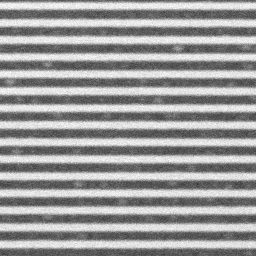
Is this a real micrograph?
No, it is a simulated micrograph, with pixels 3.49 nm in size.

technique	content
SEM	parallel lines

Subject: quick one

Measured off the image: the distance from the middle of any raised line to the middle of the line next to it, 59.5 nanometres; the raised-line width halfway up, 0.0214 microns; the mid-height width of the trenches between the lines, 10.4 pixels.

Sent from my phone